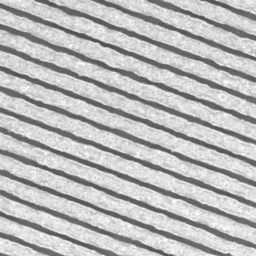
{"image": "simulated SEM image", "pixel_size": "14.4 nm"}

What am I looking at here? parallel lines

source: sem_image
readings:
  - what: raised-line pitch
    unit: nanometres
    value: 281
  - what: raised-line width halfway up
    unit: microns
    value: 0.197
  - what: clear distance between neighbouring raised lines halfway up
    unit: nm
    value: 83.5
